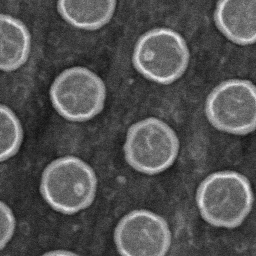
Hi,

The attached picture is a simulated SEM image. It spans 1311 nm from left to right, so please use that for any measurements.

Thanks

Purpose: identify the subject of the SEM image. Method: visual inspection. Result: raised bodies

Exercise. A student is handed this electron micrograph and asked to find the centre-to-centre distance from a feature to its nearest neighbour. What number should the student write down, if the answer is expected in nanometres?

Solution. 464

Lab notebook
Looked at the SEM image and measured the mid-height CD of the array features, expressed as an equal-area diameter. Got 266 nm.